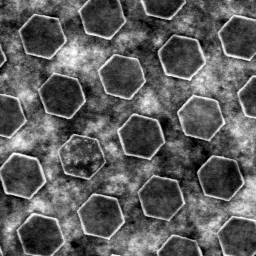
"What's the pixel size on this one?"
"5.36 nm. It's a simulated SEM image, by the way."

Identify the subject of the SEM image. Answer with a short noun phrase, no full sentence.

a regular array of raised bodies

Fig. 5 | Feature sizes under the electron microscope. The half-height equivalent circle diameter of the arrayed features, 234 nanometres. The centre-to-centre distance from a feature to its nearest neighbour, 336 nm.